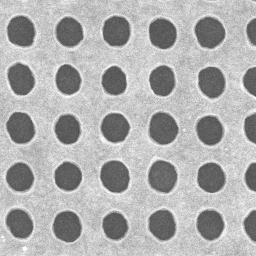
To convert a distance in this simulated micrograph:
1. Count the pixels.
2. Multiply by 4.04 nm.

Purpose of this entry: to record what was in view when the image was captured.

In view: a regular array of holes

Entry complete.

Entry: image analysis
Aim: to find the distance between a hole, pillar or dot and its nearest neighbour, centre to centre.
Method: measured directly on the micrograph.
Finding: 190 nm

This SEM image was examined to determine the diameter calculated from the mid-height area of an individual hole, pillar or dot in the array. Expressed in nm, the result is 121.